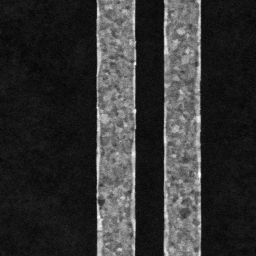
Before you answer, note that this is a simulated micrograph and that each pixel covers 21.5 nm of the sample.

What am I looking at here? wiring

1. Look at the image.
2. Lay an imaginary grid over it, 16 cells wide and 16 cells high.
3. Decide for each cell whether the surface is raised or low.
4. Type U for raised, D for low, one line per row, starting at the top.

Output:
DDDDDDUUDDUUDDDD
DDDDDDUUDDUUDDDD
DDDDDDUUDDUUDDDD
DDDDDDUUDDUUDDDD
DDDDDDUUDDUUDDDD
DDDDDDUUDDUUDDDD
DDDDDDUUDDUUDDDD
DDDDDDUUDDUUDDDD
DDDDDDUUDDUUDDDD
DDDDDDUUDDUUDDDD
DDDDDDUUDDUUDDDD
DDDDDDUUDDUUDDDD
DDDDDDUUDDUUDDDD
DDDDDDUUDDUUDDDD
DDDDDDUUDDUUDDDD
DDDDDDUUDDUUDDDD